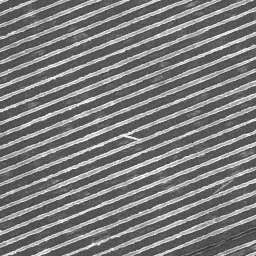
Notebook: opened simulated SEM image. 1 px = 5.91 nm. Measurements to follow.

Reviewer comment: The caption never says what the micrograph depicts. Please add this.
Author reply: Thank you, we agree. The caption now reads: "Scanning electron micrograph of parallel lines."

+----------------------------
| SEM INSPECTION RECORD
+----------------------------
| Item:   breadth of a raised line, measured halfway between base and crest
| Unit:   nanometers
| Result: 18.5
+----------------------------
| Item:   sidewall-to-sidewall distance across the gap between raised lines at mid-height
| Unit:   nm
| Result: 50.8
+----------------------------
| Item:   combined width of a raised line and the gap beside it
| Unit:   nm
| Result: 66.9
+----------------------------